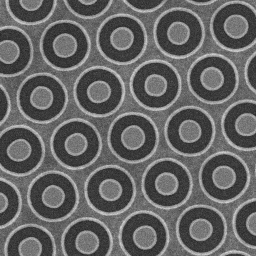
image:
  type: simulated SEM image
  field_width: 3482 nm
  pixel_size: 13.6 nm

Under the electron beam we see an array of small figures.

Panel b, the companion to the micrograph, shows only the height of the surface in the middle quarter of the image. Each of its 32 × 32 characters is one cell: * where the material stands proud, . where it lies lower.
...****************.......******
******.....*******..........****
*****........*****..........***.
****..........***....***.....**.
***...........***....****....**.
***....****....**....****....**.
***...*****....**....****....***
***...*****....**.....**.....***
.**....****....***..........****
.**...........*****........*****
****..........******......******
*****........****************...
*******....*****..**********....
**************.......*****......
*....********.........****....**
.......*****..........****...***
........****...****....***...***
........***....*****...**....***
.****....**....*****...***....**
.****....**....*****...***......
.****....***....***....****.....
.****....***..........******....
..**....*****.........********..
........******.......***********
.......**********.*****.....****
*....*****************........**
*********......******.........**
*******.........****...........*
.*****...........***...*****....
..****....***....***...*****....
...***...*****....**...*****....
...***...*****....**....****....